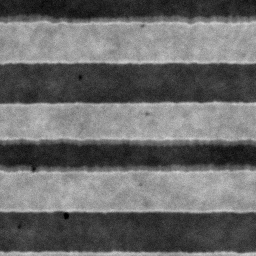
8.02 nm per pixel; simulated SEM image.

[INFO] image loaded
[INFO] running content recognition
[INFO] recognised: lines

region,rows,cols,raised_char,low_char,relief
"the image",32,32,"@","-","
--------------------------------
--------------------------------
--------------------------------
@@@@@@@@@@@@@@@@@@@@@@@@@@@@@@@@
@@@@@@@@@@@@@@@@@@@@@@@@@@@@@@@@
@@@@@@@@@@@@@@@@@@@@@@@@@@@@@@@@
@@@@@@@@@@@@@@@@@@@@@@@@@@@@@@@@
@@@@@@@@@@@@@@@@@@@@@@@@@@@@@@@@
--------------------------------
--------------------------------
--------------------------------
--------------------------------
--------------------------------
@@@@@@@@@@@@@@@@@@@@@@@@@@@@@@@@
@@@@@@@@@@@@@@@@@@@@@@@@@@@@@@@@
@@@@@@@@@@@@@@@@@@@@@@@@@@@@@@@@
@@@@@@@@@@@@@@@@@@@@@@@@@@@@@@@@
----@-----------@@-@------@-@@-@
--------------------------------
--------------------------------
--------------------------------
@-@@-@---@@---@@@@@@@@@-@@@@@@@@
@@@@@@@@@@@@@@@@@@@@@@@@@@@@@@@@
@@@@@@@@@@@@@@@@@@@@@@@@@@@@@@@@
@@@@@@@@@@@@@@@@@@@@@@@@@@@@@@@@
@@@@@@@@@@@@@@@@@@@@@@@@@@@@@@@@
--------------------------------
--------------------------------
--------------------------------
--------------------------------
--------------------------------
--------------@-----------------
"